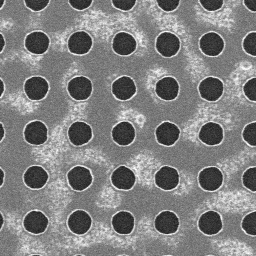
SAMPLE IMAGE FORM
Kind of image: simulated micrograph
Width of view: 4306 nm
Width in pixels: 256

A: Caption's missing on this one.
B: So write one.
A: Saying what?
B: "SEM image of a regular array of holes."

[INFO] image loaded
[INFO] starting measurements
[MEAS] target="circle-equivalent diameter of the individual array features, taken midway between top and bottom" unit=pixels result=24.3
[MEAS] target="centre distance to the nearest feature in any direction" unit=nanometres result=733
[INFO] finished